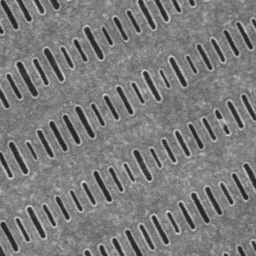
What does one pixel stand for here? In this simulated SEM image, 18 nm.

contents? a regular array of holes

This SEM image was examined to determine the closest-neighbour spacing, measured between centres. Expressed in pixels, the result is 15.